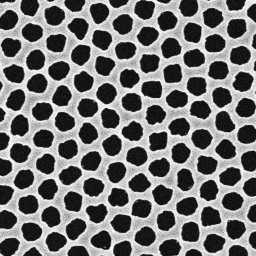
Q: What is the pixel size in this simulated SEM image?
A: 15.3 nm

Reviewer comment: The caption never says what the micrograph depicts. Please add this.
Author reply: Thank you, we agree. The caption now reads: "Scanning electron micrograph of a regular array of holes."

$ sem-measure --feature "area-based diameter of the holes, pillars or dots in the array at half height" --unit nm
305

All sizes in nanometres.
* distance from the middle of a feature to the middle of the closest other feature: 387